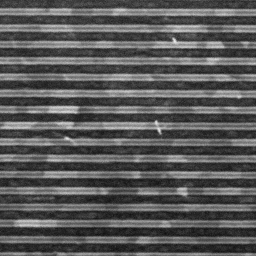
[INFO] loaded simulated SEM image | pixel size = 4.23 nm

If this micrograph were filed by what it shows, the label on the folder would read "parallel lines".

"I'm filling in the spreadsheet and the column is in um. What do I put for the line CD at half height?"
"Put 0.0222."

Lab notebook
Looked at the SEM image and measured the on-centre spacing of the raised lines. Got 68.8 nanometers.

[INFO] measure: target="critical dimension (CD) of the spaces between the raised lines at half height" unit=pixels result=10.6